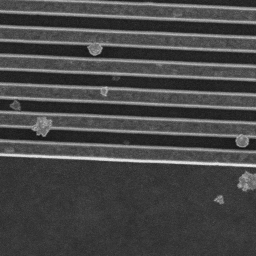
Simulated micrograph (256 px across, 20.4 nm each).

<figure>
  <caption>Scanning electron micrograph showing parallel lines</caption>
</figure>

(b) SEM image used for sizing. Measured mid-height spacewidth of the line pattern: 286 nm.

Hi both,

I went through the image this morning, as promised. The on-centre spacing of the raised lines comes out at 0.584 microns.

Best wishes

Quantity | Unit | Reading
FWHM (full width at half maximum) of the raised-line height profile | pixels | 15